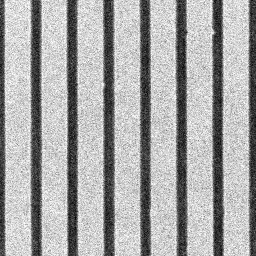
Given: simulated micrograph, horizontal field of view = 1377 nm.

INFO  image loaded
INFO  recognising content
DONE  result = parallel lines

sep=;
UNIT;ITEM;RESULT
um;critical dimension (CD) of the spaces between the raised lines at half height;0.0505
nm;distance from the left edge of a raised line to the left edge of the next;196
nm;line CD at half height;145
